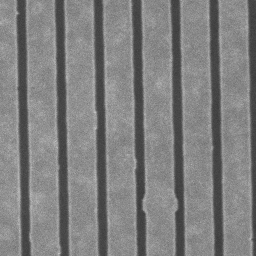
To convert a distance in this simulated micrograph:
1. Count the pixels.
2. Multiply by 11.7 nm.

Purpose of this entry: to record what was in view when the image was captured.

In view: parallel lines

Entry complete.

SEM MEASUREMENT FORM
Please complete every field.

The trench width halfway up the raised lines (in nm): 105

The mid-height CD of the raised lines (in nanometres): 337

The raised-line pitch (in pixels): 38.6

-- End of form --